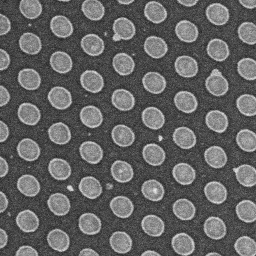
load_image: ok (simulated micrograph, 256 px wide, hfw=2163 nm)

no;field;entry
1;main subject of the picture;a regular array of raised bodies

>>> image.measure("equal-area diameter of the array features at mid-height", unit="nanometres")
177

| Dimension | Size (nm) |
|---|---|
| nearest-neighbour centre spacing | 296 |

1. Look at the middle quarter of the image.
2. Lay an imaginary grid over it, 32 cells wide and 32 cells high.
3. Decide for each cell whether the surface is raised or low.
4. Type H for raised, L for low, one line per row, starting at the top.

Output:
HHLLLLLLLLLLHHHHHLLLLLLLLLLLHHHH
HLLLLLLLLLLLLHHHHLLLLLLLLLLLHHHH
LLLLLHHHLLLLLLHHLLLLLHHLLLLLLHHH
LLLLHHHHHLLLLLLLLLLLHHHHHLLLLLLL
LLLLHHHHHHLLLLLLLLLLHHHHHLLLLLLL
LLLLLHHHHLLLLLLLLLLLHHHHHLLLLLLL
LLLLLLHHHLLLLLLLLLLLLHHHHLLLLLLL
HLLLLLLLLLLLHHHHHLLLLLLLLLLLHHHH
HHLLLLLLLLLLHHHHHLLLLLLLLLLLHHHH
HHLLLLLLLLLLHHHHHLLLLLLLLLLLHHHH
HLLLLLLLLLLLLHHHHLLLLLLLLLLLHHHH
LLLLLHHHLLLLLLLLLLLLHHHLLLLLLHHH
LLLLHHHHHLLLLLLLLLLLHHHHLLLLLLLL
LLLLHHHHHLLLLLLLLLLLHHHHHLLLLLLL
LLLLLHHHHLLLLLLLLLLLHHHHHLLLLLLL
LLLLLLHHLLLLLHHLLLLLLHHHLLLLLLLL
HLLLLLLLLLLLHHHHLLLLLLLLLLLLHHHL
HLLLLLLLLLLLHHHHHLLLLLLLLLLLHHHH
HLLLLLLLLLLLHHHHHLLLLLLLLLLHHHHH
LLLLLLLLLLLLLHHHHLLLLLLLLLLLHHHH
LLLLHHHHHLLLLLLLLLLLLHHLLLLLLHHH
LLLLHHHHHLLLLLLLLLLLHHHHHLLLLLLL
LLLLHHHHHLLLLLLLLLLLHHHHHLLLLLLL
LLLLLHHHHLLLLLLLLLLLHHHHHLLLLLLL
LLLLLLHHLLLLLHHLLLLLLHHHLLLLLLLL
HLLLLLLLLLLLHHHHLLLLLLLLLLLLHHHL
HLLLLLLLLLLLHHHHHLLLLLLLLLLHHHHH
HLLLLLLLLLLLHHHHHLLLLLLLLLLHHHHH
HLLLLHHLLLLLLHHHHLLLLLLLLLLLHHHH
LLLLHHHHHLLLLLLLLLLLHHHLLLLLLHHH
LLLLHHHHHLLLLLLLLLLLHHHHLLLLLLLL
LLLLHHHHHLLLLLLLLLLLHHHHHLLLLLLL